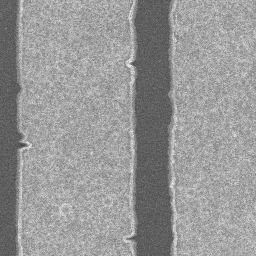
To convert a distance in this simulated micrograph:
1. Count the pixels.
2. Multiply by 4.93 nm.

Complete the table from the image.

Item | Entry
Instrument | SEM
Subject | one or a few lines or trenches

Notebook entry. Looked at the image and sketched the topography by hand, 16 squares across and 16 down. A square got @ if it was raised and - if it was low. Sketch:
-@@@@@@@---@@@@@
-@@@@@@@---@@@@@
-@@@@@@@---@@@@@
-@@@@@@@---@@@@@
-@@@@@@@---@@@@@
-@@@@@@@---@@@@@
-@@@@@@@---@@@@@
-@@@@@@@---@@@@@
-@@@@@@@---@@@@@
-@@@@@@@---@@@@@
-@@@@@@@---@@@@@
-@@@@@@@---@@@@@
-@@@@@@@---@@@@@
-@@@@@@@---@@@@@
-@@@@@@@---@@@@@
-@@@@@@@---@@@@@